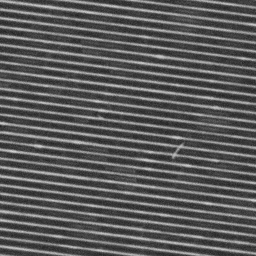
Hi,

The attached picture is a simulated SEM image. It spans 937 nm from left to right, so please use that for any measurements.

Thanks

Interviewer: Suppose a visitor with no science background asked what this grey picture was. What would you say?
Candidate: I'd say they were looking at parallel lines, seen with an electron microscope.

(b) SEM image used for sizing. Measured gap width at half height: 25 nanometres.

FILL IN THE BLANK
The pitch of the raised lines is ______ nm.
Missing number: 31.9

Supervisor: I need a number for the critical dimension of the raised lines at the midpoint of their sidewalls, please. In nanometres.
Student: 6.4